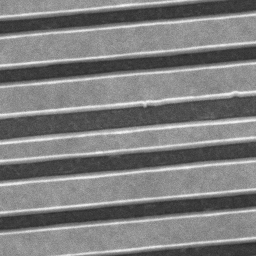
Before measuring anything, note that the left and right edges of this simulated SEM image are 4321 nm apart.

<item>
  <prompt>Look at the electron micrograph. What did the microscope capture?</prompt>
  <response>parallel lines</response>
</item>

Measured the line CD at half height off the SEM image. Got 523 nm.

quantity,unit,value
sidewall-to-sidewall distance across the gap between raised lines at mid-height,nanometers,307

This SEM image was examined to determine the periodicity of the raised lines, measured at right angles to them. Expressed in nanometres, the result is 822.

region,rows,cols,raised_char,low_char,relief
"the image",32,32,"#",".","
####################............
#########.......................
........................########
............####################
.###############################
################################
######################..........
###########.....................
........................########
.............###################
...#############################
################################
#######################.........
############....................
#...............................
.......................#########
..............##################
...###########################..
#####################...........
#########.......................
.........................#######
................################
.....###########################
################################
#########################.......
##############..................
###.........................####
..................##############
......##########################
################################
########################........
###############.................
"